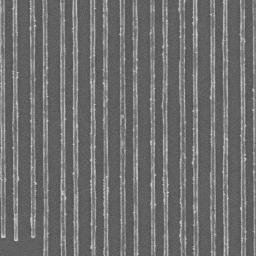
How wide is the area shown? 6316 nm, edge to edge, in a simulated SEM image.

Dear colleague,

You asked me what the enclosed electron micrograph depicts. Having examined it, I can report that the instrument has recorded parallel lines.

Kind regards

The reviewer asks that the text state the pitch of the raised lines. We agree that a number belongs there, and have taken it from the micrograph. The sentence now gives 372 nanometers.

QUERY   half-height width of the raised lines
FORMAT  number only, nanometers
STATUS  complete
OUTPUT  92.5